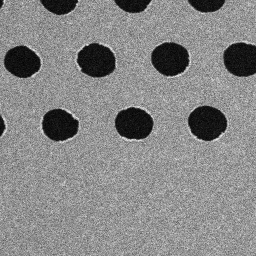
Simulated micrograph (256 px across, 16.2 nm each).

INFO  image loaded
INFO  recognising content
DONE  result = holes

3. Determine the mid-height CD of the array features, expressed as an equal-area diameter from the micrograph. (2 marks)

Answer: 581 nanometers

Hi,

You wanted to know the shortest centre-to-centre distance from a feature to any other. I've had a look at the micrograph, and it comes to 1190 nm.